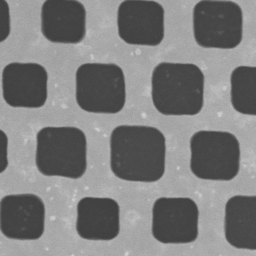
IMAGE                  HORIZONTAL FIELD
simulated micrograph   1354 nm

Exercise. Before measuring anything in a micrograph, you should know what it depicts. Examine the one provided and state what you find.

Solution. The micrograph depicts a regular array of holes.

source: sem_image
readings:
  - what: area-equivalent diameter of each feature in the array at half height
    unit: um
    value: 0.281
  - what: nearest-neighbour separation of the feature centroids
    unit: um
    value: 0.401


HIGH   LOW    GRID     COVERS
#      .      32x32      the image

.####.....#####.....#####.....##
.####......####.....####......##
.####......####......###......##
.####......####......###......##
.#####....#####.....####......##
################....#####.....##
################################
################################
#....#####.....####......#####..
......####.....####......####...
......###.......###......####...
......###.......###......####...
#.....####......###......####...
##########.....#####.....####...
################################
################################
#####.....####......#####...####
.####......###.......###......##
.####......###.......###......##
.###.......###.......###......##
.####......###.......###......##
#####......###......####......##
################....############
################################
#....#########################..
.....#####.....####.....####....
......####.....####......###....
......####.....####......###....
......####.....####......###....
#....#####.....####......###....
#############################...
################################